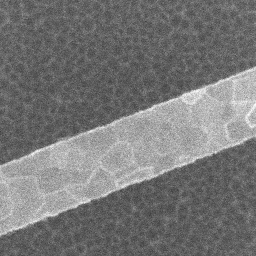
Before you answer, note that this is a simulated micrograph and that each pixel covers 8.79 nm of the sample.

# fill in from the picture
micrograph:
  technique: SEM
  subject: one or a few lines or trenches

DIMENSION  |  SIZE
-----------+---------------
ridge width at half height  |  565 nm